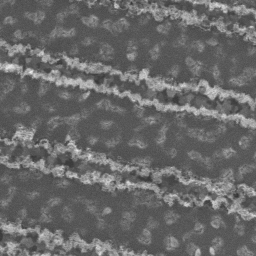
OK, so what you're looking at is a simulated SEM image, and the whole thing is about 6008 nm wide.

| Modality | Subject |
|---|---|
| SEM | one or a few lines or trenches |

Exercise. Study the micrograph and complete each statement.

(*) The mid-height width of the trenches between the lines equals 1550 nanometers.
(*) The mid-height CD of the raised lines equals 489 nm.